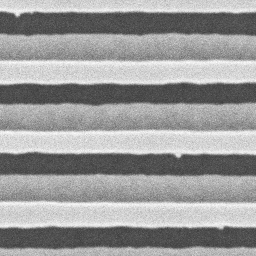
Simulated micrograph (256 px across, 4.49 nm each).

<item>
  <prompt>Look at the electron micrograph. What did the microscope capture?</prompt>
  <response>lines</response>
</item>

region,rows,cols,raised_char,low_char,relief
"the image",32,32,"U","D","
UUUUUUUUUUUUUUUUUUUUUUUUUUUUUUUU
DUUUDDDDDDDDDDDDDDDDDDDDDDDDDUDD
DDDDDDDDDDDDDDDDDDDDDDDDDDDDDDDD
DDDDDDDDDDDDDDDDDDDDDDDDDDDDDDDD
UUUDUUUUUUUUUUUUUUUUUUUUUUUUUUUD
UUUUUUUUUUUUUUUUUUUUUUUUUUUUUUUU
UUUUUUUUUUUUUUUUUUUUUUUUUUUUUUUU
UUUUUUUUUUUUUUUUUUUUUUUUUUUUUUUU
UUUUUUUUUUUUUUUUUUUUUUUUUUUUUUUU
UUUUUUUUUUUUUUUUUUUUUUUUUUUUUUUU
DDDDDDDDDDDDDDDDDDDDDDDDDDDDDDDD
DDDDDDDDDDDDDDDDDDDDDDDDDDDDDDDD
DDDDDDDDDDDDDDDDDDDDDDDDDDDDDDDD
UUUUUUUUUUUUUUUUUUUUUUUUUUUUUUUU
UUUUUUUUUUUUUUUUUUUUUUUUUUUUUUUU
UUUUUUUUUUUUUUUUUUUUUUUUUUUUUUUU
UUUUUUUUUUUUUUUUUUUUUUUUUUUUUUUU
UUUUUUUUUUUUUUUUUUUUUUUUUUUUUUUU
UUUUUUUUUUUUUUUUUUUUUUUUUUUUUUUU
DDDDDDDDDDDDDDDDDDDDDDDDDDDDDDDD
DDDDDDDDDDDDDDDDDDDDDDDDDDDDDDDD
DDDDDDDDDDDDDDDDDDDDDDDDDDDDDDDD
UUUUUUUUUUUUUUUUUUUUUUUUUUUUUUUU
UUUUUUUUUUUUUUUUUUUUUUUUUUUUUUUU
UUUUUUUUUUUUUUUUUUUUUUUUUUUUUUUU
UUUUUUUUUUUUUUUUUUUUUUUUUUUUUUUU
UUUUUUUUUUUUUUUUUUUUUUUUUUUUUUUU
UUUUUUUUUUUUUUUUUUUUUUUUUUUUUUUU
DDDDDDDDDDDDDDDDDDDDDDDDDDDUDDDD
DDDDDDDDDDDDDDDDDDDDDDDDDDDDDDDD
DDDDDDDDDDDDDDDDDDDDDDDDDDDDDDDD
UUUUUUUUUUUUUUUUUUUUUUUUUUUUUUUU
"